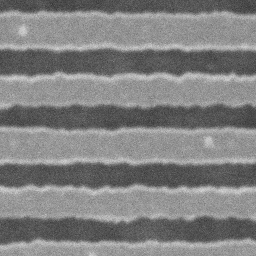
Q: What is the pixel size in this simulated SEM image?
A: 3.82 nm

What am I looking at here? lines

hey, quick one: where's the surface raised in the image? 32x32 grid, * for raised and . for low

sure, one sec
................................
................................
********************************
********************************
********************************
********************************
................................
................................
................................
.**..*******..********.*******..
********************************
********************************
********************************
................................
................................
................................
********************************
********************************
********************************
********************************
...*..***.......**....*.*.......
................................
................................
***********..*..*****.*****.*.**
********************************
********************************
********************************
................................
................................
................................
.*******************************
********************************